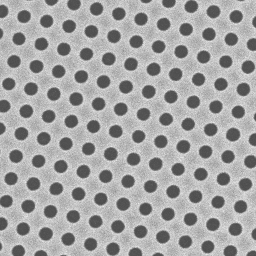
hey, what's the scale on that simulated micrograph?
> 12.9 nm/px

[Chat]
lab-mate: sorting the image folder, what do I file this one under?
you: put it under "a regular array of holes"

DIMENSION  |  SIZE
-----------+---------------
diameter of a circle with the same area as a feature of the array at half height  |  178 nanometers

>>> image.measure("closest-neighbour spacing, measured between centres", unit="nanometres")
295